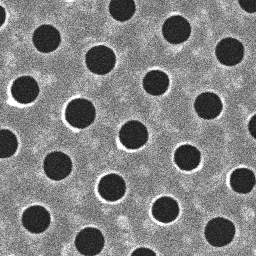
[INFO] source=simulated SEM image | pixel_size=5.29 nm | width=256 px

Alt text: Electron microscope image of a regular array of holes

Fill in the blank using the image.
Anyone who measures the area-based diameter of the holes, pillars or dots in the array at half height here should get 153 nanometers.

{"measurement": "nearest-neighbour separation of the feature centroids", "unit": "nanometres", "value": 300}